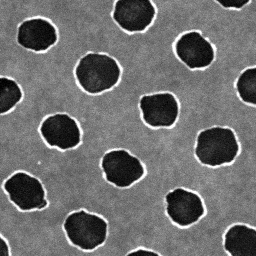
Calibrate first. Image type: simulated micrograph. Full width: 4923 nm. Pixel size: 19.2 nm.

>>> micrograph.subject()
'a regular array of holes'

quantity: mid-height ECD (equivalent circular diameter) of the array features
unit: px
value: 38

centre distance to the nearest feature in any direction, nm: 1330